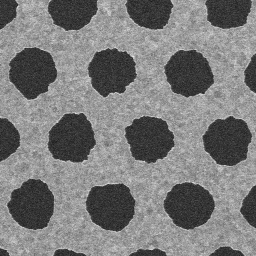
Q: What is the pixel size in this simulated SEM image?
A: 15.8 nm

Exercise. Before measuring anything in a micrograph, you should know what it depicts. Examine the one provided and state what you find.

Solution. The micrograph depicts a regular array of holes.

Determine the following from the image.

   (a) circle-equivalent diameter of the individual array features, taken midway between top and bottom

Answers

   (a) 766 nanometres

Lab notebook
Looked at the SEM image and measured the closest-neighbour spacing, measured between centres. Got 77.2 pixels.